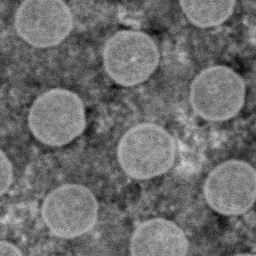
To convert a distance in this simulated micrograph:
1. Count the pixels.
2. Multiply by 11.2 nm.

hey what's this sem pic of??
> raised bodies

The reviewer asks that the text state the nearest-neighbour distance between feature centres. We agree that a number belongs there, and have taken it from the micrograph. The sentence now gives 1060 nanometres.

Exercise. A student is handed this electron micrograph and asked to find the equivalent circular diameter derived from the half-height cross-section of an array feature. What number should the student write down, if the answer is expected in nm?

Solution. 604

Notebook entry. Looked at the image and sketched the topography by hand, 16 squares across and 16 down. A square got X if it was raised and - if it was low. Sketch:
-XXX-------XXXX-
-XXX--------XX--
--XX---XX-------
-------XXX------
-------XX----XX-
------------XXX-
--XXX-------XXX-
--XXX-----------
--XXX---XXX-----
-------XXXX-----
X-------XX----XX
X------------XXX
---XXX-------XXX
---XXX----------
---XX----XX-----
X-------XXXX----